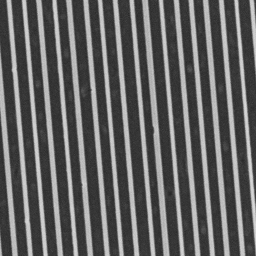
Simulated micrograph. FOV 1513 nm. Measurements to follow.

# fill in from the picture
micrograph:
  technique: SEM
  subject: parallel lines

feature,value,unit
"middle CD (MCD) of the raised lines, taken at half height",27.2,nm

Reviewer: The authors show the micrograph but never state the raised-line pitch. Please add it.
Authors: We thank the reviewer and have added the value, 0.0893 micrometres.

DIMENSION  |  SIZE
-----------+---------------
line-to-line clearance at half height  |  65.5 nanometers